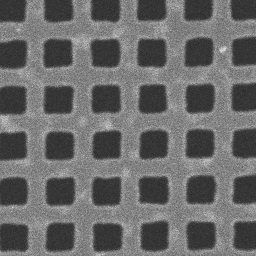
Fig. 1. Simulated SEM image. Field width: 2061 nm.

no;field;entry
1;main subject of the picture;a regular array of holes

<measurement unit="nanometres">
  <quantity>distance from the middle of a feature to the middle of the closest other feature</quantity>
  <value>367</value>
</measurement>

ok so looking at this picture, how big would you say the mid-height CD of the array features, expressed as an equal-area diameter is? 258 nanometres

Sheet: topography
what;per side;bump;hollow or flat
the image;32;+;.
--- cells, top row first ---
...++....++....++....++....++...
...+++...++....++....++....++...
...+++...+++...++...+++...+++..+
++++++++++++++++++++++++++++++++
++++++++++++++++++++++++++++++++
...++....++....++....++....++...
....+....++....++....++....++...
...++....++....++....++....++...
...++++++++++.++++++++++++++++++
++++++++++++++++++++++++++++++++
+++++++++++++.+++++.+++++.+++...
...+++...++....++....++....++...
...+++...++....++....++....++...
...++....++....++....++....++...
++++++++++++++++++++++++++++++++
++++++++++++++++++++++++++++++++
++.+++...+++...+++...++....++...
...+++...++....++....++....++...
...+++...++....++....++....++...
...+++...+++...++....++...+++...
++++++++++++++++++++++++++++++++
++++++++++++++++++++++++++++++++
...+++...+++...++....+++...++...
....++...+++...++....++....++...
...+++...++....++....++....++...
...+++...+++...++++..+++..++++.+
++++++++++++++++++++++++++++++++
++++++++++++++++++++++++++++++++
....++...+++...+++...++....++...
....++...+++...++....++....++...
....++...+++...++....++....++...
.+++++.+++++.+++++++++++++++++++